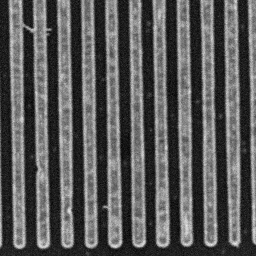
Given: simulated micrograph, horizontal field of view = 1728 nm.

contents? parallel lines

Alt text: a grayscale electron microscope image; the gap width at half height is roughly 94.5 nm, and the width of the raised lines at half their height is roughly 69.2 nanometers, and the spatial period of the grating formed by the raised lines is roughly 23.9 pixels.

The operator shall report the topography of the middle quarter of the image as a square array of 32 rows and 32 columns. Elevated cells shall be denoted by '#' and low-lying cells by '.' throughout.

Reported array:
#....##....##....##....##....##.
#....##....##....##....##....##.
#....##....##....##....##....##.
#....##....##....##....##....##.
##...##....##....##....##....##.
##...##....##....##....##....##.
##...##....##....##....##....##.
##...##....##....##....##....##.
##...##....##....##....##....##.
##...##....##....##....##....##.
##...##....##....##....##....##.
##...##....##....##....##....##.
##...##....##....##....##....##.
##...##....##....##....##....##.
##...##....##....##....##....##.
##...##....##....##....##....##.
#....###...##....##....##....##.
#....###...##....##....##....###
#....###....#....##....##....###
##...###....#....##....##....###
##...###....#....##....##....###
##....##....#....##....##....##.
##....##...##....##....###...##.
##....##...##....##....###...##.
##....#....###...###...###...##.
##....#....###...###...###...##.
##....##...###...###....##....#.
##....##...###...###....##....#.
##....##...###...###....##....#.
##....##...###...###....##....#.
##....##...###...###...###....#.
#.....##...###...###...###....#.